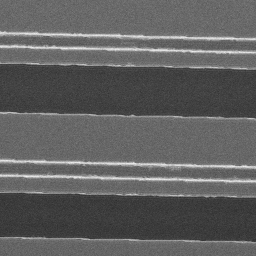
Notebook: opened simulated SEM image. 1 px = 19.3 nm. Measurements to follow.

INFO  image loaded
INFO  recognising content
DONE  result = lines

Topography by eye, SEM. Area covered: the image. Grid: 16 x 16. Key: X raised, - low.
XXXXXXXXXXXXXXXX
XXXXXXXXXXXXXXXX
XXXXXXXXXXXXXXXX
XXXXXXXXXXXXXXXX
----------------
----------------
----------------
XXXXXXXXXXXXXXXX
XXXXXXXXXXXXXXXX
XXXXXXXXXXXXXXXX
XXXXXXXXXXXXXXXX
XXXXXXXXXXXXXXXX
----------------
----------------
----------------
XXXXXXXXXXXXXXXX